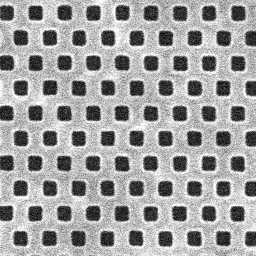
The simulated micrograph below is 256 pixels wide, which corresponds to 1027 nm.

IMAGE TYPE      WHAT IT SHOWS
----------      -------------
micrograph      a regular array of holes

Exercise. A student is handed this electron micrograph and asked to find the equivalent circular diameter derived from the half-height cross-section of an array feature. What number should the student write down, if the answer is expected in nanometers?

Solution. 68.4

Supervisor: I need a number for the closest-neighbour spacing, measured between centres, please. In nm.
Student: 114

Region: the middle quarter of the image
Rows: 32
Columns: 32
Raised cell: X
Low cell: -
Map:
--XXX----XXXX----XXX----XXX----X
--XXXX---XXXX---XXXX---XXXX----X
XXXXXXXXXXXXXXXXXXXXXXXXXXXXXXXX
XXXXXXXXXXXXXXXXXXXXXXXXXXXXXXXX
XX---XXXX----XXX----XXXX---XXXX-
XX----XXX----XXX----XXX----XXXX-
XX----XXX----XXX----XXX----XXXX-
XX----XXX----XXX----XXXX---XXXX-
XXXXXXXXXXXXXXXXXXXXXXXXXXXXXXXX
XXXXXXXXXXXXXXXXXXXXXXXXXXXXXXXX
--XXXX---XXXX---XXXX---XXXXX--XX
--XXX----XXXX---XXXX----XXX----X
--XXX----XXXX---XXXX----XXX----X
--XXXX---XXXX---XXXX----XXX----X
XXXXXXXXXXXXXX-XXXXXX--XXXXXX-XX
XXXXXXXXXXXXXXXXXXXXXXXXXXXXXXXX
XXXXXXXXXXXXXXXXXXXXXXXXXXXXXXXX
XX----XXX----XXX----XXX----XXXX-
XX----XXX----XXX----XXX----XXXX-
XX----XXX----XXX----XXX----XXXX-
XXX--XXXXX--XXXXX---XXXX---XXXX-
XXXXXXXXXXXXXXXXXXXXXXXXXXXXXXXX
XXXXXXXXXXXXXXXXXXXXXXXXXXXXXXXX
--XXX----XXXX---XXXX---XXXX----X
--XXX----XXX----XXXX----XXX----X
--XXX----XXX----XXXX----XXX----X
--XXXX---XXXX---XXXX---XXXX----X
XXXXXXXXXXXXXXXXXXXXXXXXXXXXXXXX
XXXXXXXXXXXXXXXXXXXXXXXXXXXXXXXX
XX---XXXX---XXXX----XXXX---XXXX-
XX----XXX----XXX----XXX----XXXX-
XX----XXX----XXX----XXX----XXXX-